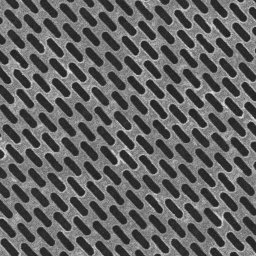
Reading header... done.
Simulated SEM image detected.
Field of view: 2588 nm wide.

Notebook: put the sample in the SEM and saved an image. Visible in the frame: a regular array of holes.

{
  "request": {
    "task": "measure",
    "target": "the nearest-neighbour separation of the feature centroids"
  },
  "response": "199 nanometers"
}